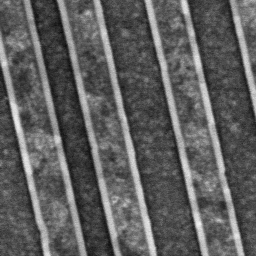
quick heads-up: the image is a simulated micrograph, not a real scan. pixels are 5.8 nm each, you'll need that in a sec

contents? one or a few lines or trenches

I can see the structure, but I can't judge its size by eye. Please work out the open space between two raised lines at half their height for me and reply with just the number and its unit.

276 nanometers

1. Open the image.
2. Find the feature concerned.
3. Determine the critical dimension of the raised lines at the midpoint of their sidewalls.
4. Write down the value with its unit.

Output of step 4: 203 nm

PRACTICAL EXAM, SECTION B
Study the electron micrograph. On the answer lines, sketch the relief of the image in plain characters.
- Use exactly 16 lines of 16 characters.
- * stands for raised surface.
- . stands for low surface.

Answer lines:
**..**...***...*
**..**....**...*
**..***...**...*
**...**...**...*
***..**...**....
.**..**...***...
.**..**....**...
.**..***...**...
.***..**...**...
.***..**...***..
..**..**....**..
..**..***...**..
..**...**...**..
..***..**...**..
...**..**...***.
...**..**....**.